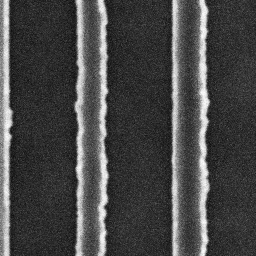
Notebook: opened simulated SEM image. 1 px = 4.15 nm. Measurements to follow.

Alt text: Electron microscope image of one or a few lines or trenches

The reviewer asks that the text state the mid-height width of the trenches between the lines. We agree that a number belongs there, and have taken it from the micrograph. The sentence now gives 283 nm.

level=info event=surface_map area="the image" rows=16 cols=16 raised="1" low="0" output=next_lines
1000011000011000
1000011000011000
0000011000011000
1000011000011000
0000011000011000
1000011000011000
1000011000011000
1000011000011000
1000011000011000
1000010000011000
1000011000011000
1000011000011000
1000011000011000
1000011000011000
1000011000011000
1000011000011000